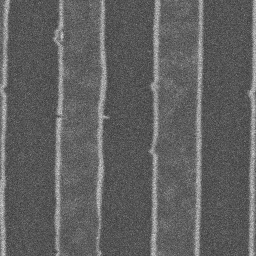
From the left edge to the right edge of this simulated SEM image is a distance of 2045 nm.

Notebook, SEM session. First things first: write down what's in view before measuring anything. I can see one or a few lines or trenches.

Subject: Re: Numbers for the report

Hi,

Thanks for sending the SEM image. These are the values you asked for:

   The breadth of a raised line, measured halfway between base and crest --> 0.357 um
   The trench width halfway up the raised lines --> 424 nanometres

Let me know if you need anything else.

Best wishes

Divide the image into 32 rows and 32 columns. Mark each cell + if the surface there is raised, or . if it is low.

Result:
+.......+++++.......+++++.......
+.......+++++.......+++++.......
+.......+++++......++++++.......
+......++++++......++++++.......
+......++++++......++++++.......
+......++++++......++++++.......
+.......+++++.......+++++.......
+.......+++++.......+++++.......
+.......+++++......++++++.......
+.......+++++......++++++.......
+.......+++++......++++++.......
........+++++......++++++......+
+.......+++++......++++++.......
+......++++++......++++++.......
+.......+++++.......+++++.......
+......++++++......++++++.......
+......++++++......++++++.......
.......+++++.......++++++.......
.......++++++......++++++.......
.......++++++......++++++.......
.......++++++......++++++.......
.......++++++......++++++......+
.......++++++......++++++......+
.......+++++.......++++++......+
.......+++++.......++++++......+
.......+++++.......++++++.......
.......+++++.......++++++.......
.......++++++......++++++.......
.......++++++......++++++......+
.......+++++.......++++++......+
.......+++++.......++++++......+
.......+++++.......++++++......+